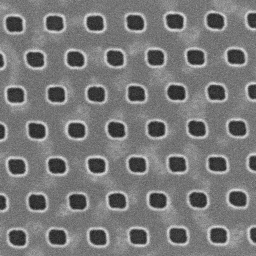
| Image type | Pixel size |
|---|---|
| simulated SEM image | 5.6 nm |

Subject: a regular array of holes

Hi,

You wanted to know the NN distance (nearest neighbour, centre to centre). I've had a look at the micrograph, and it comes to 0.224 um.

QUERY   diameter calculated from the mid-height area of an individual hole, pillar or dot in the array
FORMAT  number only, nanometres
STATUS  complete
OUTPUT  103